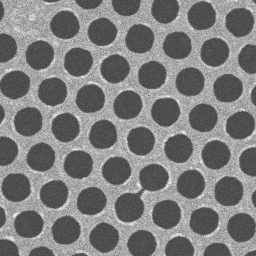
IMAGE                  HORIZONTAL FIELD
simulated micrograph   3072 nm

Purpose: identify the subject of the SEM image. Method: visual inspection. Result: a regular array of holes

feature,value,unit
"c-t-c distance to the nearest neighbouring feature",456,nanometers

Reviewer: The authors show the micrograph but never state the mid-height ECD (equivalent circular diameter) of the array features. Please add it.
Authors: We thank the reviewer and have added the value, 0.354 µm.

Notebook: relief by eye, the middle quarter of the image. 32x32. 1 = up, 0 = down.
00000001100000001110000001111111
00000001100000000110000000111000
10000011100000001100000000110000
11111111110000011110000001110000
11111111111000111110000001110000
01111000011111111110000011110000
01110000001111111111111111110000
01100000001111000011111111111000
01100000001110000001111100011111
11100000001100000000111000001111
11100000001100000000110000000111
11110000011100000001110000000111
00111111111110000001110000000110
00011111111111000011110000000110
00001111000011111111111000001110
00001110000001111111111100011111
00001110000001110000001111111111
00001100000001110000001111111011
00011100000001110000000111000001
01111110000001110000000110000000
11111110000011110000000110000000
11111111111111110000001110000000
10000011111111111100011110000000
00000001111000011111111111000001
00000001110000001111111111100011
00000001110000000111000011111111
00000001100000000110000000111110
10000001100000000110000000111000
11000111110000001110000000110000
11111111111000011110000000110000
01111110111111111110000000110000
01111000011111111110000011110000